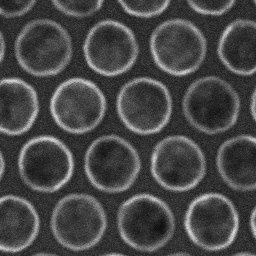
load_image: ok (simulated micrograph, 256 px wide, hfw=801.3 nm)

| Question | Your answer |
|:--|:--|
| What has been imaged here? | a regular array of raised bodies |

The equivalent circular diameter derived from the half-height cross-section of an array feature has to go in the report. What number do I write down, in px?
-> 53.2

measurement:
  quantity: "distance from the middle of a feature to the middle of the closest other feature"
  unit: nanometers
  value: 208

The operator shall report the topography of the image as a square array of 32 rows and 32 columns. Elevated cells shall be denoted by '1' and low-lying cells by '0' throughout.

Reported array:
11110001111100011111100011111000
11100000111000001111000000110000
00000000000000000000000000000000
00011111000011110000111100000111
00011111000111110001111110001111
00111111100111111001111110001111
00111111100111111001111110011111
00111111000111111000111110001111
00011111000011110000011100000111
00000000000000000000000000000000
11100000111000001111000011110000
11110001111100011111100011111000
11110001111110011111100111111100
11110001111110011111100111111100
11110001111110011111100011111000
11110001111100001111000011111000
01000000000000000010000000000000
00001110000011100000011000000111
00011111000111110000111110001111
00011111100111111001111110011111
00011111100111111001111110011111
00011111100111111001111110001111
00011111000011110000111110001111
00001110000001110000011000000010
00000000000000000000000000100000
11100000111100001111000011111000
11110001111110011111100011111000
11111001111110011111100111111101
11111001111110011111100111111000
11110001111100011111100011111000
11110000111000001111000001110000
00000000000000000000000000000000